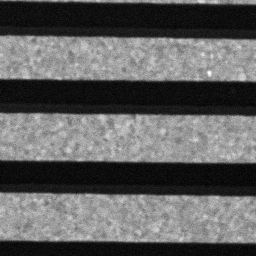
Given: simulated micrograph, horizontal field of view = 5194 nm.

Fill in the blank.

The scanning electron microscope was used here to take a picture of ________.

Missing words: lines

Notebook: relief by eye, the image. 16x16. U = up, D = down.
DDDDDDDDDDDDDDDD
DDDDDDDDDDDDDDDD
UUUUUUUUUUUUUUUD
UUUUUUUUUUUUUUUU
UUUUUUUUUUUUUUUU
DDDDDDDDDDDDDDDD
DDDDDDDDDDDDDDDD
UUUUUUUUUUUUUUUU
UUUUUUUUUUUUUUUU
UUUUUUUUUUUUUUUU
DDDDDDDDDDDDDDDD
DDDDDDDDDDDDDDDD
UUUUUUUUUUUUUUUU
UUUUUUUUUUUUUUUU
UUUUUUUUUUUUUUUU
DDDDDDDDDDDDDDDD